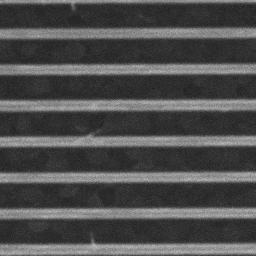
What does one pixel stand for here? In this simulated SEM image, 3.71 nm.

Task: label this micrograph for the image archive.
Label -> parallel lines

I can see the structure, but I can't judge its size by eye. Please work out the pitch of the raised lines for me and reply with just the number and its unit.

134 nanometers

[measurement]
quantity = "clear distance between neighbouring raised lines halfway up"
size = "26 pixels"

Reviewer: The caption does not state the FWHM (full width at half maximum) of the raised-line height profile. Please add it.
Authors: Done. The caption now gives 37.1 nanometers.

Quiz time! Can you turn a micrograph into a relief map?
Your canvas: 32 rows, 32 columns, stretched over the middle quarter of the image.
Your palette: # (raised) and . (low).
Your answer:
################################
################################
#####.######....................
................................
................................
................................
................................
................................
................................
################################
################################
############....................
................................
................................
................................
................................
................................
................................
#######....#####################
################################
#.....####.##...................
................................
................................
................................
................................
................................
................................
##########..####################
################################
#############...................
................................
................................